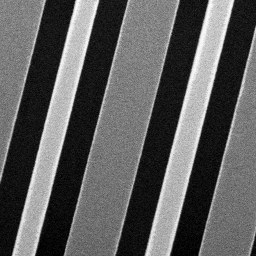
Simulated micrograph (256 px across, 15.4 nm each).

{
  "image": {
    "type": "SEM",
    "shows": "lines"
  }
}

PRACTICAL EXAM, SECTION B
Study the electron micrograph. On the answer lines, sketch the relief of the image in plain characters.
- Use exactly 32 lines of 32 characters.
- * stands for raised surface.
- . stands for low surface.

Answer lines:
******...***....******....***...
*****....***....******....***...
*****....***...*******...****...
*****....**....*******...***....
*****...***....******....***....
****....***....******....***...*
****....***...*******....***...*
****....***...*******...***....*
****...***....******....***....*
***....***....******....***...**
***....***...*******....***...**
***....**....*******...***....**
***...***....******....***....**
**....***....******....***...***
**....***...*******...****...***
**....**....******....***....***
**...***....******....***....***
*....***....******....***...****
*....***...*******....***...****
*....**....*******...***....****
*...***....******....***....****
....***....******....***...*****
....***...*******....***...*****
....**....*******...***....*****
...***....******....***....*****
...***....******....***...******
...***...*******...****...******
...**....*******...***....******
..***....******....***....******
..***....******....***...*******
..***...*******...****...*******
..**....*******...***....******.